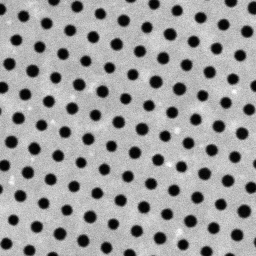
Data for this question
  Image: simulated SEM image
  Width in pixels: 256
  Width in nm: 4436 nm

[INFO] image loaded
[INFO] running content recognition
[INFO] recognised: a regular array of holes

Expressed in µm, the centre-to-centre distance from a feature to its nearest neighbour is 0.419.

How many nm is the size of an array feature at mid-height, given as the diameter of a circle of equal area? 211